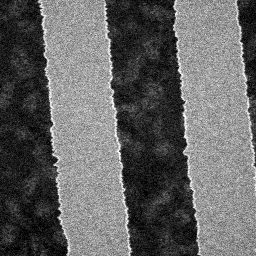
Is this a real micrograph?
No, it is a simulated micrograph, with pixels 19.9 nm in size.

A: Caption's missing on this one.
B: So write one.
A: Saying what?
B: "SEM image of one or a few lines or trenches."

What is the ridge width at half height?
1260 nanometers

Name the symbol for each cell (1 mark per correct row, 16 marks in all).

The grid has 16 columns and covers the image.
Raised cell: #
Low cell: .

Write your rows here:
...####....####.
...####....####.
...####....####.
...####....####.
...####....####.
...####....####.
...####.....###.
...####.....####
...####.....####
...####.....####
....####....####
....####....####
....####....####
....####....####
....####....####
....####....####